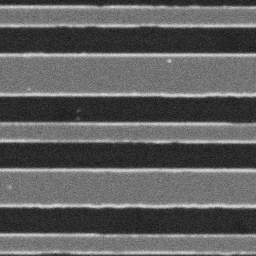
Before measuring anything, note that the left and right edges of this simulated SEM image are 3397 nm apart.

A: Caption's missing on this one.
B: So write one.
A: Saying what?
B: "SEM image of lines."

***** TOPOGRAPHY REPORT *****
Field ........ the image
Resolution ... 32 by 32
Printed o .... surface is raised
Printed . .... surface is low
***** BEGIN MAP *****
................................
oooooooooooooooooooooooooooooooo
oooooooooooooooooooooooooooooooo
................................
................................
................................
................................
oooooooooooooooooooooooooooooooo
oooooooooooooooooooooooooooooooo
oooooooooooooooooooooooooooooooo
oooooooooooooooooooooooooooooooo
oooooooooooooooooooooooooooooooo
................................
................................
................................
ooooooooooooooooooooooooooooo...
oooooooooooooooooooooooooooooooo
oooooooooooooooooooooooooooooooo
................................
................................
................................
oooooooooooooooooooooooooooooooo
oooooooooooooooooooooooooooooooo
oooooooooooooooooooooooooooooooo
oooooooooooooooooooooooooooooooo
oooooooooooooooooooooooooooooooo
................................
................................
................................
oooooooooooooooooooooooooooooooo
oooooooooooooooooooooooooooooooo
oooooooooooooooooooooooooooooooo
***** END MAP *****